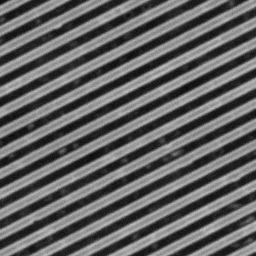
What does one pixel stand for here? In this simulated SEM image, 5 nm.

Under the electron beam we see parallel lines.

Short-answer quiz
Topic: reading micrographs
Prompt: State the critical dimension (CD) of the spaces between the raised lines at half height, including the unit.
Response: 47.8 nanometres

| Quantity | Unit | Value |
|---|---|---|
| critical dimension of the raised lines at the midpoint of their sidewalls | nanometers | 43.3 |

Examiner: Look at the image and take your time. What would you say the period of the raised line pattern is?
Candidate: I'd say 90.6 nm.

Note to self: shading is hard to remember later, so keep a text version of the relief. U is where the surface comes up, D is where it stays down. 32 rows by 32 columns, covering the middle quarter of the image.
DDDDUUUUUDDDDDUUUUUDDDDDUUUUUDDD
DDUUUUUDDDDDUUUUUDDDDDUUUUUDDDDD
DUUUUDDDDDUUUUUDDDDDUUUUUDDDDDUU
UUUDDDDDDUUUUDDDDDUUUUUDDDDDUUUU
UDDDDDDUUUUDDDDDDUUUUDDDDDUUUUUD
DDDDDUUUUDDDDDDUUUUDDDDDDUUUUDDD
DDDUUUUDDDDDDUUUUDDDDDDUUUUDDDDD
DUUUUDDDDDDUUUUDDDDDDUUUUDDDDDDU
UUUDDDDDDUUUUDDDDDDUUUUDDDDDDUUU
UDDDDDDUUUUDDDDDDUUUUDDDDDDUUUUD
DDDDDUUUUDDDDDDUUUUDDDDDDUUUUDDD
DDDUUUUDDDDDDUUUUDDDDDDUUUUDDDDD
DUUUUUDDDDDUUUUDDDDDDUUUUDDDDDDU
UUUUDDDDDUUUUUDDDDDUUUUDDDDDUUUU
UUDDDDDUUUUUDDDDDUUUUDDDDDDUUUUD
DDDDDUUUUUDDDDDUUUUDDDDDDUUUUDDD
DDDUUUUUDDDDDUUUUDDDDDDUUUUDDDDD
DUUUUUDDDDDUUUUDDDDDDUUUUDDDDDDU
UUUUDDDDDUUUUDDDDDDUUUUDDDDDDUUU
UUDDDDDUUUUDDDDDDUUUUDDDDDDUUUUD
DDDDDUUUUDDDDDDUUUUDDDDDDUUUUDDD
DDDUUUUDDDDDDUUUUDDDDDDUUUUDDDDD
DUUUUUDDDDDUUUUDDDDDDUUUUDDDDDDU
UUUUDDDDDUUUUUDDDDDUUUUDDDDDDUUU
UUDDDDDDUUUUDDDDDDUUUUDDDDDUUUUU
DDDDDUUUUUDDDDDDUUUUDDDDDUUUUUDD
DDDUUUUUDDDDDUUUUUDDDDDUUUUUDDDD
DDUUUUDDDDDUUUUUDDDDDUUUUUDDDDDU
UUUUDDDDDUUUUUDDDDDUUUUUDDDDDUUU
UUDDDDDDUUUUDDDDDUUUUUDDDDDDUUUU
DDDDDUUUUUDDDDDUUUUUDDDDDDUUUUDD
DDDDUUUUDDDDDUUUUUDDDDDUUUUUDDDD